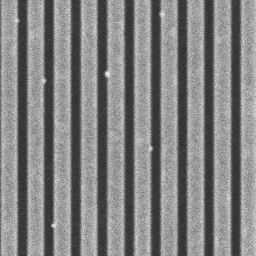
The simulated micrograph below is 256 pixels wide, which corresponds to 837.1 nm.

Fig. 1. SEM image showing parallel lines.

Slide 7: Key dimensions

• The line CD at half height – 56.1 nm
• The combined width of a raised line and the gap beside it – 87.2 nm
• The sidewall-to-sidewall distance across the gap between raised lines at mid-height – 31.1 nanometers